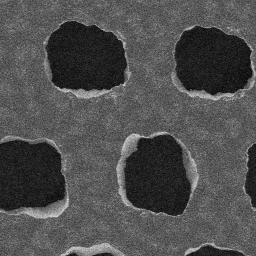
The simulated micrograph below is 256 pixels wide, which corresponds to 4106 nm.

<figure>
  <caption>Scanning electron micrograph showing holes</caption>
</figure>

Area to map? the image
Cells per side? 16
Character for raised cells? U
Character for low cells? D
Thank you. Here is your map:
UUUUUUUUUUUUUUUU
UUUUDUUUUUUUUUUU
UUUDDDDUUUUDDDDU
UUUDDDDDUUUDDDDD
UUUDDDDDUUUDDDDD
UUUUDDDUUUUDDDDU
UUUUUUUUUUUUUUUU
UUUUUUUUUUUUUUUU
UUUUUUUUUUDUUUUU
DDDDUUUUDDDDUUUU
DDDDUUUUDDDDUUUD
DDDDUUUUDDDDUUUD
DDDDUUUUDDDDUUUU
UUUUUUUUUUUUUUUU
UUUUUUUUUUUUUUUU
UUUUUUUUUUUUUUUU